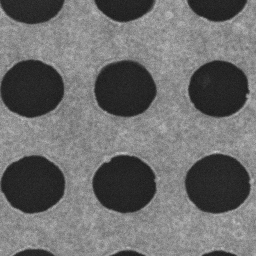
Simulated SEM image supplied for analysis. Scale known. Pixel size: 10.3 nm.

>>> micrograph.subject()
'holes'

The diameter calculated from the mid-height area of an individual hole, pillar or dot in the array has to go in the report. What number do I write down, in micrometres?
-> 0.621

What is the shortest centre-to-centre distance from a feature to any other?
0.968 um